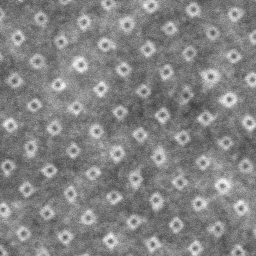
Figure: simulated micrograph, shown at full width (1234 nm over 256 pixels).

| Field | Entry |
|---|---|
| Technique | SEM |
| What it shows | holes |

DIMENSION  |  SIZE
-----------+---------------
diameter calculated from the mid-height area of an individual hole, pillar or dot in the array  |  16.3 nm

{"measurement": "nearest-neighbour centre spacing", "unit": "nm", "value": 79.5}